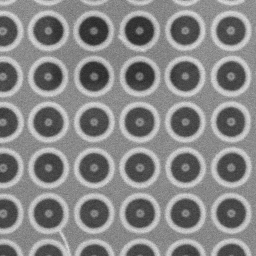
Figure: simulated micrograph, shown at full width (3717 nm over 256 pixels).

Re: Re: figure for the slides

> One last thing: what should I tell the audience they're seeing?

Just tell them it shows an array of small figures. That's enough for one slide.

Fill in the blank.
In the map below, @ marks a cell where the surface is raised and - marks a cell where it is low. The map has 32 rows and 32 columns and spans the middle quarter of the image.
@@@@-------@@@@@------@@@@@-----
@@@@-------@@@@--------@@@------
@@@---------@@@--------@@@------
@@@----@----@@---------@@@----@-
@@@---------@@@--------@@@------
@@@@-------@@@@--------@@@@-----
@@@@@-----@@@@@@------@@@@@@----
@@@@@@@-@@@@@@@@@@-@@@@@@@@@@@-@
@@@@@@@@@@@@@@@@@@@@@@@@@@@@@@@@
@@@@@@@@@@@@@@@@@@@@@@@@@@@@@@@@
@@@@@@---@@@@@@@@---@@@@@@@@@---
@@@@@------@@@@@------@@@@@-----
@@@@-------@@@@--------@@@@-----
@@@---------@@@--------@@@------
-@@----@----@@@---@@---@@@----@-
@@@---------@@@--------@@@------
@@@@-------@@@@--------@@@------
@@@@-------@@@@@------@@@@@-----
@@@@@@---@@@@@@@@----@@@@@@@----
@@@@@@@@@@@@@@@@@@@@@@@@@@@@@@@@
@@@@@@@@@@@@@@@@@@@@@@@@@@@@@@@@
@@@@@@@-@@@@@@@@@@@@@@@@@@@@@@-@
@@@@@-----@@@@@@-----@@@@@@@----
@@@@-------@@@@--------@@@@-----
@@@---------@@@--------@@@------
-@@----@----@@@--------@@@----@-
@@@---------@@@--------@@@------
@@@---------@@@--------@@@------
@@@@-------@@@@-------@@@@@-----
@@@@@-----@@@@@@-----@@@@@@@----
@@@@@@@@@@@@@@@@@@@@@@@@@@@@@@@@
@@@@@@@@@@@@@@@@@@@@@@@@@@@@@@@@